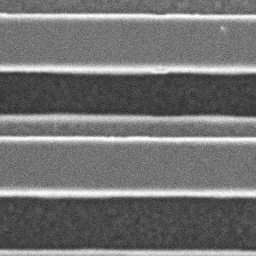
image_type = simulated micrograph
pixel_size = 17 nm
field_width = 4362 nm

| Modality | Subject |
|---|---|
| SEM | lines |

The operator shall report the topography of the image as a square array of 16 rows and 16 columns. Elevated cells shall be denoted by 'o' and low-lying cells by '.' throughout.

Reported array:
oooooooooooooooo
oooooooooooooooo
oooooooooooooooo
oooooooooooooooo
................
................
................
oooooooooooooooo
oooooooooooooooo
oooooooooooooooo
oooooooooooooooo
oooooooooooooooo
................
................
................
................